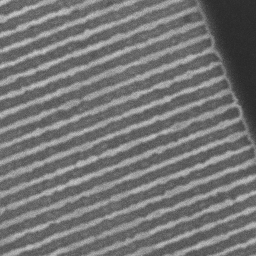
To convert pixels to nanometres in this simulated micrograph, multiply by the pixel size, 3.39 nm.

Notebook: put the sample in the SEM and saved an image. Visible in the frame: parallel lines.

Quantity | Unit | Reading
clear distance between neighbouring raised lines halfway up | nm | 35.7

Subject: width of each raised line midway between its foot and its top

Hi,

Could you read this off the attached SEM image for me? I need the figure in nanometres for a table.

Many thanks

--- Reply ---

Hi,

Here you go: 15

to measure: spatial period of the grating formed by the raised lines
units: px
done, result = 14.9